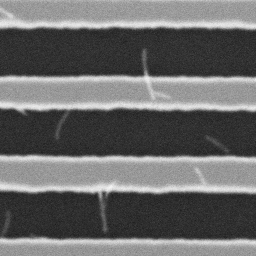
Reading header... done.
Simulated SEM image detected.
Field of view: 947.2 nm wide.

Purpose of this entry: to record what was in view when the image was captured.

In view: lines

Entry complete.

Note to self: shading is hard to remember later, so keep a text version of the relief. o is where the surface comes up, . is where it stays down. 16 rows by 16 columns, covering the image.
oooooooooooooooo
oooooooooooooooo
................
................
................
oooooooooooooooo
oooooooooooooooo
................
................
................
oooooooooooooooo
oooooooooooooooo
................
................
................
oooooooooooooooo